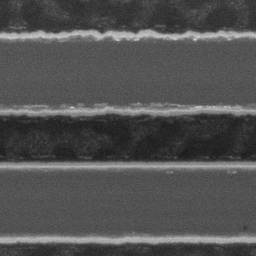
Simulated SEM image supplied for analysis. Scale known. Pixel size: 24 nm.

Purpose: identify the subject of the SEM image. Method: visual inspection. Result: one or a few lines or trenches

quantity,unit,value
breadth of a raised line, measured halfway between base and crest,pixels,75.9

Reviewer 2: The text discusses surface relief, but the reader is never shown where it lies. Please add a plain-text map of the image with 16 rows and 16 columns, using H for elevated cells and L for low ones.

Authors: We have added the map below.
LLLLLLLLLLLLLLLL
LLLLLLLLLLLLLLLL
HHHHHHHHHHHHHHHH
HHHHHHHHHHHHHHHH
HHHHHHHHHHHHHHHH
HHHHHHHHHHHHHHHH
HHHHHHHHHHHHHHHH
LLLLLLLLLLLLLLLL
LLLLLLLLLLLLLLLL
LLLLLLLLLLLLLLLL
HHHHHHHHHHHHHHHH
HHHHHHHHHHHHHHHH
HHHHHHHHHHHHHHHH
HHHHHHHHHHHHHHHH
HHHHHHHHHHHHHHHH
LLLLLLLLLLLLLLLL